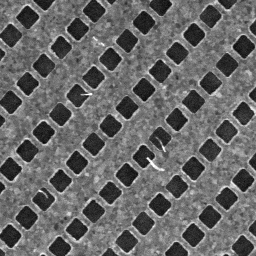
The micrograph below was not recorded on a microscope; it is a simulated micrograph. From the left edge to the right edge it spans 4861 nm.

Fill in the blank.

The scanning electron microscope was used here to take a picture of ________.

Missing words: a regular array of holes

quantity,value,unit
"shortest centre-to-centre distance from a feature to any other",0.467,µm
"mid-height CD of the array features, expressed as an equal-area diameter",386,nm